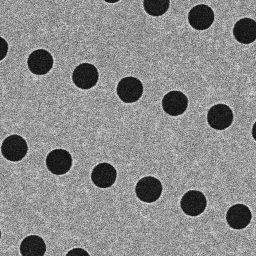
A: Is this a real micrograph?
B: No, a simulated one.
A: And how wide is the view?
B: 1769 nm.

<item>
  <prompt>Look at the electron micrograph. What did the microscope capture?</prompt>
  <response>a regular array of holes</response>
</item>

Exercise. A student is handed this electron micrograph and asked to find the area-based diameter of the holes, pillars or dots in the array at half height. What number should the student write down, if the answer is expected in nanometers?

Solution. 184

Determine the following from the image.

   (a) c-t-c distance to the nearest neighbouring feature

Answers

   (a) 324 nanometers